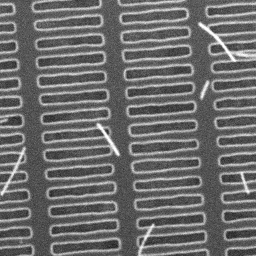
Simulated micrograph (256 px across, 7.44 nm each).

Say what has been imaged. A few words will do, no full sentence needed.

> groups of lines, slits or small figures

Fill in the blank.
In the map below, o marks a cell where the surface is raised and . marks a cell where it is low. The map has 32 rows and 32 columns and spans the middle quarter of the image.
ooooooooooooooooooooooooooo.....
oooooooooooooooo................
..o.......ooooo.................
..........ooooo.....oooooooooooo
.........ooooooooooooooooooooooo
ooooooooooooooooooooo...........
oooooooooooooooo................
...........ooooo.............ooo
...........ooooooooooooooooooooo
....oooooooooooooooooooooooooooo
oooooooooooooooooooo............
ooooooo....ooooo................
...........ooooo..........oooooo
...........ooooooooooooooooooooo
oooooooooooooooooooooooooooo....
ooooooooooooooooo...............
ooooo....o.ooooo...............o
...........oooooo.....oooooooooo
........oooooooooooooooooooooooo
oooooooooooooooooooooo..........
ooooooooooooooooo...............
............ooooo............ooo
...........oooooo....ooooooooooo
....oooooooooooooooooooooooooooo
oooooooooooooooooo..............
ooooooo.....ooooo...............
............ooooo........ooooooo
...........ooooooooooooooooooooo
....oooooooooooooooooooooooooo..
oooooooooooooooooo..............
ooo..........ooooo..............
.............ooooo...ooooooooooo